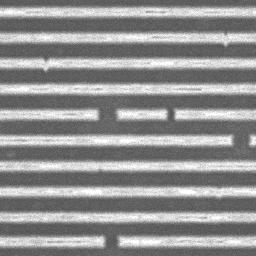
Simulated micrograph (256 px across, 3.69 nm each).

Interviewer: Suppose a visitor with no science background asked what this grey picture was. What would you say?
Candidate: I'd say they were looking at parallel lines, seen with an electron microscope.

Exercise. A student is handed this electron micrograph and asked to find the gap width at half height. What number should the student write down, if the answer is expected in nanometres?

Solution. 56.8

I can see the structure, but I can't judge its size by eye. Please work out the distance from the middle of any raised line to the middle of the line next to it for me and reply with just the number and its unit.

0.0941 um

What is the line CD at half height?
39.2 nanometres